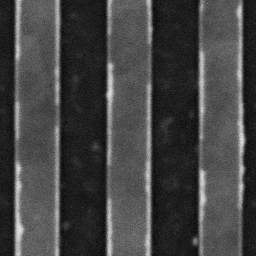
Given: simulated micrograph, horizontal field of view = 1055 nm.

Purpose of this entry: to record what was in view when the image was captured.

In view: one or a few lines or trenches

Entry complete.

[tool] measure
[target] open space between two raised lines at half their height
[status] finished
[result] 204 nm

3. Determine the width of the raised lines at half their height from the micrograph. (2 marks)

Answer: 176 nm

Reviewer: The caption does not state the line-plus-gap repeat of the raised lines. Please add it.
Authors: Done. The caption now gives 378 nm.